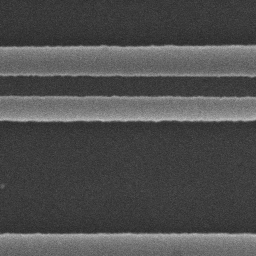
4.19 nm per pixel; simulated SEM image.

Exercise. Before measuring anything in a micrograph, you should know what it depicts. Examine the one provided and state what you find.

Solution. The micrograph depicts lines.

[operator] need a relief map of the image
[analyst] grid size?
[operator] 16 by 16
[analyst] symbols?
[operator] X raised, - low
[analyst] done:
----------------
----------------
----------------
XXXXXXXXXXXXXXXX
XXXXXXXXXXXXXXXX
XXXXXXXXXXXXXXXX
XXXXXXXXXXXXXXXX
XXXXXXXXXXXXXXXX
----------------
----------------
----------------
----------------
----------------
----------------
----------------
XXXXXXXXXXXXXXXX